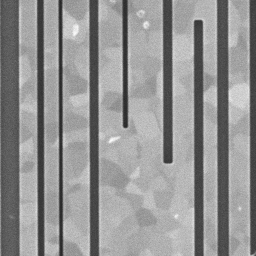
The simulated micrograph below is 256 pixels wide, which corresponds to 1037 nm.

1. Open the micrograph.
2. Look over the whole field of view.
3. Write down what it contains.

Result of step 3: groups of lines, slits or small figures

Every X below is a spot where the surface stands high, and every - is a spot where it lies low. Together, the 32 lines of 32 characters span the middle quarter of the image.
XXXXXX---XXXXX--XXXXXXXXX--XXXXX
XXXXXX---XXXXX--XXXXXXXXX--XXXXX
XXXXXX---XXXXX--XXXXXXXXX--XXXXX
XXXXXX---XXXXX--XXXXXXXXX--XXXXX
XXXXXX---XXXXX--XXXXXXXXX--XXXXX
XXXXXX---XXXXX--XXXXXXXXX--XXXXX
XXXXXX---XXXXX--XXXXXXXXX--XXXXX
XXXXXX---XXXXX--XXXXXXXXX--XXXXX
XXXXXX---XXXXX--XXXXXXXXX--XXXXX
XXXXXX---XXXXX--XXXXXXXXX--XXXXX
XXXXXX---XXXXX--XXXXXXXXX--XXXXX
XXXXXX---XXXXX--XXXXXXXXX--XXXXX
XXXXXX---XXXXX--XXXXXXXXX--XXXXX
XXXXXX---XXXXX--XXXXXXXXX--XXXXX
XXXXXX---XXXXX--XXXXXXXXX--XXXXX
XXXXXX---XXXXXX-XXXXXXXXX--XXXXX
XXXXXX---XXXXXXXXXXXXXXXX--XXXXX
XXXXXX---XXXXXXXXXXXXXXXX--XXXXX
XXXXXX---XXXXXXXXXXXXXXXX--XXXXX
XXXXXX---XXXXXXXXXXXXXXXX--XXXXX
XXXXXX---XXXXXXXXXXXXXXXX--XXXXX
XXXXXX---XXXXXXXXXXXXXXXX--XXXXX
XXXXXX---XXXXXXXXXXXXXXXX--XXXXX
XXXXXX---XXXXXXXXXXXXXXXX--XXXXX
XXXXXX---XXXXXXXXXXXXXXXX--XXXXX
XXXXXX---XXXXXXXXXXXXXXXXXXXXXXX
XXXXXX---XXXXXXXXXXXXXXXXXXXXXXX
XXXXXX---XXXXXXXXXXXXXXXXXXXXXXX
XXXXXX---XXXXXXXXXXXXXXXXXXXXXXX
XXXXXX---XXXXXXXXXXXXXXXXXXXXXXX
XXXXXX---XXXXXXXXXXXXXXXXXXXXXXX
XXXXXX---XXXXXXXXXXXXXXXXXXXXXXX